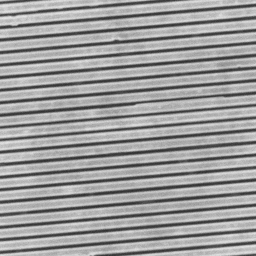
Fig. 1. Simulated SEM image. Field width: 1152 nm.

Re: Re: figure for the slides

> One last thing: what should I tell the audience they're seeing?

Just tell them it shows parallel lines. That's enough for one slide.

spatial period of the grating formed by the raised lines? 56 nm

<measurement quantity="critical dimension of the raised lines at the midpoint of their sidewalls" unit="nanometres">34.8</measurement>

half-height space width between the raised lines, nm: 21.9